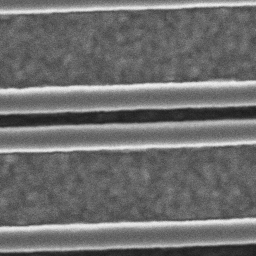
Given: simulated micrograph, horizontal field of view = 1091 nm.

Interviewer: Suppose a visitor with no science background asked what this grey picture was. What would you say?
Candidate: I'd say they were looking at lines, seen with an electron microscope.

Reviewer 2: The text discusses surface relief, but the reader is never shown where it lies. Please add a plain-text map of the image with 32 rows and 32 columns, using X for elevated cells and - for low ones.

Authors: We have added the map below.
XXXXXXXXXXXXXXXXXXXXXXXXXXXXXXXX
XXXXXX--------------------------
--------------------------------
--------------------------------
--------------------------------
--------------------------------
--------------------------------
--------------------------------
--------------------------------
--------------------------------
-------------------XXXXXXXXXXXXX
XXXXXXXXXXXXXXXXXXXXXXXXXXXXXXXX
XXXXXXXXXXXXXXXXXXXXXXXXXXXXXXXX
XXXXXXXXXXXXXXXXXXXXXXX---------
--------------------------------
--------------XXXXXXXXXXXXXXXXXX
XXXXXXXXXXXXXXXXXXXXXXXXXXXXXXXX
XXXXXXXXXXXXXXXXXXXXXXXXXXXXXXXX
XXXXXXXXXXXXXXXXX---------------
--------------------------------
--------------------------------
--------------------------------
--------------------------------
--------------------------------
--------------------------------
--------------------------------
--------------------------------
-----------------------------XXX
XXXXXXXXXXXXXXXXXXXXXXXXXXXXXXXX
XXXXXXXXXXXXXXXXXXXXXXXXXXXXXXXX
XXXXXXXXXXXXXXXXXXXXXXXXXXXX----
X-------------------------------